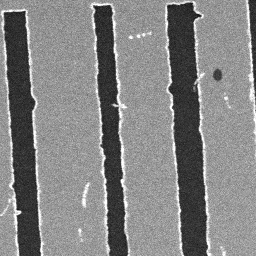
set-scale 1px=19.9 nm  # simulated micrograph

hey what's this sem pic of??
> one or a few lines or trenches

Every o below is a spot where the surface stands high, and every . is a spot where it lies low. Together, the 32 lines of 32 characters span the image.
ooooooooooooooooooooooo.ooooooo.
o..ooooooooo..ooooooo....oooooo.
...ooooooooo..ooooooo...ooooooo.
...ooooooooo..ooooooo...ooooooo.
...ooooooooo..ooooooo...ooooooo.
o...oooooooo..ooooooo...ooooooo.
o...oooooooo..ooooooo...ooooooo.
o...oooooooo..ooooooo....oooooo.
o...oooooooo...oooooo....oooooo.
o...oooooooo...oooooo....ooooooo
o...oooooooo...oooooo....ooooooo
o...oooooooo...oooooo....ooooooo
o...oooooooo...ooooooo...ooooooo
o...oooooooo...ooooooo...ooooooo
o...ooooooooo..ooooooo...ooooooo
o...ooooooooo..ooooooo...ooooooo
o...ooooooooo..ooooooo...ooooooo
o...ooooooooo..ooooooo...ooooooo
o...ooooooooo..ooooooo...ooooooo
o....oooooooo..ooooooo...ooooooo
oo...oooooooo..ooooooo...ooooooo
oo...oooooooo..ooooooo....oooooo
oo...oooooooo..ooooooo....oooooo
oo...oooooooo..ooooooo....oooooo
oo...oooooooo...oooooo....oooooo
oo...oooooooo...oooooo....oooooo
oo...oooooooo...oooooo....oooooo
oo...oooooooo...ooooooo...oooooo
oo...oooooooo...ooooooo...oooooo
oo...oooooooo...ooooooo...oooooo
oo...oooooooo...ooooooo...oooooo
oo...ooooooooo..ooooooo...oooooo